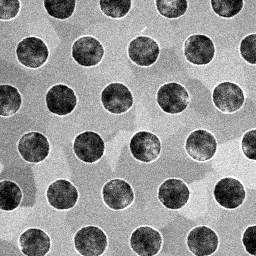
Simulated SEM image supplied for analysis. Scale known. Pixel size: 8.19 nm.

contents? a regular array of holes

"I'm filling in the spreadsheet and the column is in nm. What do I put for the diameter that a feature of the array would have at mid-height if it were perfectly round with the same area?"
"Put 258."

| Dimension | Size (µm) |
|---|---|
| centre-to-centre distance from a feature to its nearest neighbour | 0.451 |